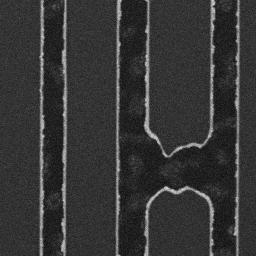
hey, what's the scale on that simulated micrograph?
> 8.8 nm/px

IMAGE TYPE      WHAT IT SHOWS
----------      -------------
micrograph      one or a few lines or trenches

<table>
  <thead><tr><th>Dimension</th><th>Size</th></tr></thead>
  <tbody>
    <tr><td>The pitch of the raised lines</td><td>748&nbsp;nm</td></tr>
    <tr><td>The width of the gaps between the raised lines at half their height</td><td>0.459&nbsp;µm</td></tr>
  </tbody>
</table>